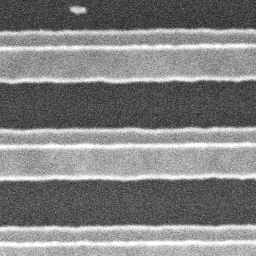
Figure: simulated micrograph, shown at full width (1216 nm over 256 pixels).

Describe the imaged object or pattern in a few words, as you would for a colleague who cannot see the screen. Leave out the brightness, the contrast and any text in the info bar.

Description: lines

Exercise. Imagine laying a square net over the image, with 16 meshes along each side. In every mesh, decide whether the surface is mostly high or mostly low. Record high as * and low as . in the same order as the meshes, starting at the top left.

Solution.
................
................
****************
****************
****************
................
................
................
****************
****************
****************
................
................
................
****************
****************